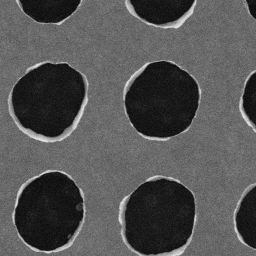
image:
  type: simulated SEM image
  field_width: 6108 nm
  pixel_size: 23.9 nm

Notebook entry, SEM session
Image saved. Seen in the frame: holes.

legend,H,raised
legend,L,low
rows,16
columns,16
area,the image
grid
HLLLLHHHLLLLHHHH
HHHHHHHHHHLHHHHH
HHHHHHHHHHHHHHHH
HHHHHHHHHHHHHHHH
HHLLLHHHHLLLHHHH
HLLLLHHHLLLLHHHL
HLLLLHHHLLLLHHHL
HLLLLHHHLLLLHHHH
HHHLHHHHHLLHHHHH
HHHHHHHHHHHHHHHH
HHHHHHHHHHHHHHHH
HHLLLHHHHLLHHHHH
HLLLLHHHLLLLHHHL
HLLLLHHHLLLLHHHL
HLLLLHHHLLLLHHHL
HHLLHHHHLLLHHHHH